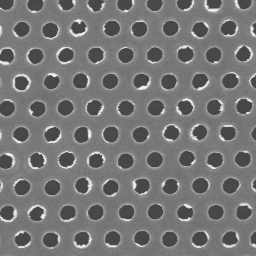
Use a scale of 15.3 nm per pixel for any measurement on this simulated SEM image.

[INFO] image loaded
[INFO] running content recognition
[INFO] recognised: a regular array of holes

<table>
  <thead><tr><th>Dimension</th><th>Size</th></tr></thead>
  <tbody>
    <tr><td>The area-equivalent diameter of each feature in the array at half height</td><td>0.231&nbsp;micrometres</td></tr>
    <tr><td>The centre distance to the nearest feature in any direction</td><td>0.44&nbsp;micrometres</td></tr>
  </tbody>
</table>